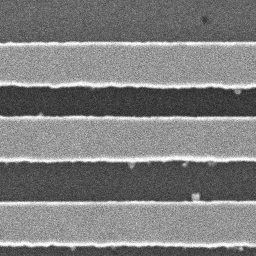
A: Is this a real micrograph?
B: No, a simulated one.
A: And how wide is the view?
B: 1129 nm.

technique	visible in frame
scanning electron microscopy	lines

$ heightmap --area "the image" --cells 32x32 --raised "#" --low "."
................................
................................
................................
................................
................................
################################
################################
################################
################################
################################
################################
................................
................................
................................
................................
################################
################################
################################
################################
################################
................................
................................
................................
................................
................................
################################
################################
################################
################################
################################
################################
................................